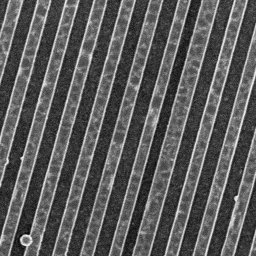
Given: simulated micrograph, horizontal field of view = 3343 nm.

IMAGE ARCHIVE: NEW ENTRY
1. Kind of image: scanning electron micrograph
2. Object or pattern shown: parallel lines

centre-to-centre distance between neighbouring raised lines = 354 nm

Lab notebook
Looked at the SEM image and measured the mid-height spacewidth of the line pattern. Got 189 nm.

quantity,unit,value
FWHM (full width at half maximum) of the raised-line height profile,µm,0.165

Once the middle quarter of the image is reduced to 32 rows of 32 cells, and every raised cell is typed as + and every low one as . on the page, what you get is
...+++....+++....+++....+++...++
...+++....+++....+++....+++...++
...+++....+++....+++....+++...++
..+++....++++...+++.....++...+++
..+++....+++....+++....+++...+++
..+++....+++....+++....+++...+++
.++++...++++...++++....+++..++++
.+++....+++....+++....+++...++++
.+++....+++....+++....+++...++++
.+++....+++....+++....+++...++++
++++...++++...+++....+++...++++.
+++....+++....+++....+++...++++.
+++....+++....+++....+++...++++.
+++....+++....+++....+++...++++.
++....++++...+++....+++...++++..
++....+++....+++....+++...++++..
++....+++....+++....+++...++++..
++...++++...++++....+++..+++++..
+....+++....+++....+++...++++...
+....+++....+++....+++...++++...
+....+++....+++....+++...++++...
+...++++...+++....+++...++++....
....+++....+++....+++...++++....
....+++....+++....+++...++++....
....+++....+++....+++...++++....
...++++...+++....+++...++++....+
...+++....+++....+++...++++....+
...+++....+++....+++...++++....+
..++++...++++....+++..+++++....+
..+++....+++....+++...++++....++
..+++....+++....+++...++++....++
..+++....+++....+++...++++....++